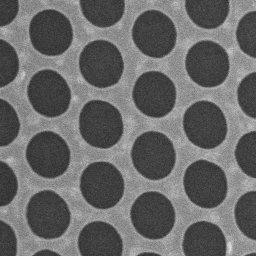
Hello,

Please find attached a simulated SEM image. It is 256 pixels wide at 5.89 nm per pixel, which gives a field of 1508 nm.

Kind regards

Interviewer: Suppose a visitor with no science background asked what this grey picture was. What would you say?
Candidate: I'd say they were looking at a regular array of holes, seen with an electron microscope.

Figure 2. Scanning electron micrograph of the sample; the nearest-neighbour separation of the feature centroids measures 350 nm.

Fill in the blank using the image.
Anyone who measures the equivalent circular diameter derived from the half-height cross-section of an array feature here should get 274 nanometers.